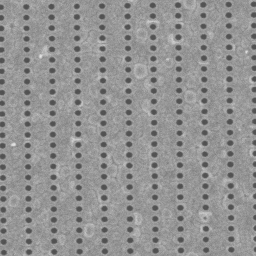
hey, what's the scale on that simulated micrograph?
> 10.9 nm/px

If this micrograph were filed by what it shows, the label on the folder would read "a regular array of holes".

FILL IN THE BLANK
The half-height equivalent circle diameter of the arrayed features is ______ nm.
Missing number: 65.4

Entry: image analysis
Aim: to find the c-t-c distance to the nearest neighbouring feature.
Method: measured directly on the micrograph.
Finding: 115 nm